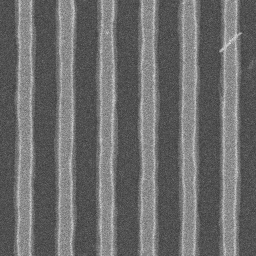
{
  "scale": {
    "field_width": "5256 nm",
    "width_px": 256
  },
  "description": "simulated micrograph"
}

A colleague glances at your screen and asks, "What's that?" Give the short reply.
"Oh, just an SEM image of parallel lines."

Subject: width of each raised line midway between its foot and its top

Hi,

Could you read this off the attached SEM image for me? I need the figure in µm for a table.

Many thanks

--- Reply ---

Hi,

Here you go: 0.318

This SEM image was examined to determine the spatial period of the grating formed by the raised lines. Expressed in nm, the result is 842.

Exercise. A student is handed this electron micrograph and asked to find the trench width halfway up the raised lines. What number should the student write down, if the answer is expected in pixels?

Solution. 26.1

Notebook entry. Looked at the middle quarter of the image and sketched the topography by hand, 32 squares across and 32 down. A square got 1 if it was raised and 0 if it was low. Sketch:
11000000011110000001111000000011
11000000011110000001111000000011
11000000011110000001111000000011
11000000011110000001111000000111
11000000011110000001111000000111
11000000011110000001111000000011
11000000011110000001111000000011
11100000011110000001111000000111
11100000011110000001111000000111
11000000011110000001111000000111
11000000011110000001111000000111
11000000011110000001111000000111
11000000011110000001111000000111
11000000011110000001111000000111
11000000011110000001111000000111
11000000011110000001111000000111
11000000011110000001111000000111
11000000011110000001111000000111
11000000011110000001111000000111
11000000011110000001111000000111
11000000011110000001111000000111
11000000011110000001111000000111
11000000011100000001111000000111
11000000011100000001111000000011
11000000011100000001111000000011
11000000011100000001111000000111
11000000011100000001111000000111
11000000011100000001111000000111
11000000011100000001111000000011
11000000011100000001111000000011
11000000011100000001111000000011
11000000011100000001111000000011